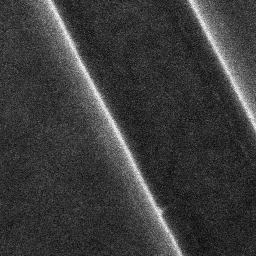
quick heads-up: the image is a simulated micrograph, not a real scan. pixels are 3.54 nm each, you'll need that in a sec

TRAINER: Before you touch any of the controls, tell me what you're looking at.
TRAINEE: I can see one or a few lines or trenches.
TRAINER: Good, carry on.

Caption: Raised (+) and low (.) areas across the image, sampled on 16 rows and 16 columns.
+++.........++++
++++.........+++
++++.........+++
+++++.........++
+++++.........++
++++++.........+
++++++.........+
+++++++.........
++++++++........
++++++++........
++++++++........
+++++++++.......
++++++++++......
++++++++++......
+++++++++++.....
+++++++++++.....